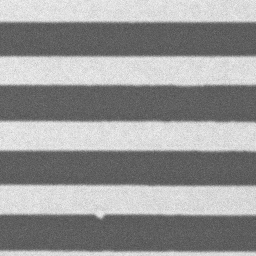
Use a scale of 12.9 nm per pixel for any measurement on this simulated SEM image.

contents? lines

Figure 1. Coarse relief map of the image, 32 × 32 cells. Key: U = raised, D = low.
UUUUUUUUUUUUUUUUUUUUUUUUUUUUUUUU
UUUUUUUUUUUUUUUUUUUUUUUUUUUUUUUU
UUUUUUUUUUUUUUUUUUUUUUUUUUUUUUUU
DDDDDDDDDDDDDDDDDDDDDDDDDDDDDDDD
DDDDDDDDDDDDDDDDDDDDDDDDDDDDDDDD
DDDDDDDDDDDDDDDDDDDDDDDDDDDDDDDD
DDDDDDDDDDDDDDDDDDDDDDDDDDDDDDDD
UUUUUUUUUUUUUUUUUUUUUUUUUUUUUUUU
UUUUUUUUUUUUUUUUUUUUUUUUUUUUUUUU
UUUUUUUUUUUUUUUUUUUUUUUUUUUUUUUU
UUUUUUUUUUUUUUUUUUUUUUUUUUUUUUUU
DDDDDDDDDDDDDDDDDDDDDDDDDDDDDDDD
DDDDDDDDDDDDDDDDDDDDDDDDDDDDDDDD
DDDDDDDDDDDDDDDDDDDDDDDDDDDDDDDD
DDDDDDDDDDDDDDDDDDDDDDDDDDDDDDDD
UUUUUUUUUUUUUUUUUUUUUUUUUUUUUUUU
UUUUUUUUUUUUUUUUUUUUUUUUUUUUUUUU
UUUUUUUUUUUUUUUUUUUUUUUUUUUUUUUU
UUUUUUUUUUUUUUUUUUUUUUUUUUUUUUUU
DDDDDDDDDDDDDDDDDDDDDDDDDDDDDDDD
DDDDDDDDDDDDDDDDDDDDDDDDDDDDDDDD
DDDDDDDDDDDDDDDDDDDDDDDDDDDDDDDD
DDDDDDDDDDDDDDDDDDDDDDDDDDDDDDDD
UUUUUUUUUUUUUUUUUUUUUUUUUUUUUUUU
UUUUUUUUUUUUUUUUUUUUUUUUUUUUUUUU
UUUUUUUUUUUUUUUUUUUUUUUUUUUUUUUU
UUUUUUUUUUUUUUUUUUUUUUUUUUUUUUUU
DDDDDDDDDDDDDDDDDDDDDDDDDDDDDDDD
DDDDDDDDDDDDDDDDDDDDDDDDDDDDDDDD
DDDDDDDDDDDDDDDDDDDDDDDDDDDDDDDD
DDDDDDDDDDDDDDDDDDDDDDDDDDDDDDDD
UUUUUUUUDDDDDDDDDDDDDDDDDDDDDDDD